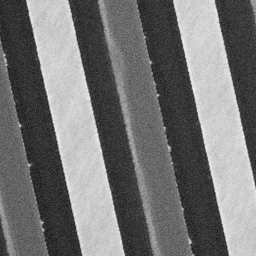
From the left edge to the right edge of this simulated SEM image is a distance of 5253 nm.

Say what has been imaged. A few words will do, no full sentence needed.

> lines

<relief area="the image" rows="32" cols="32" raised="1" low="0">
00011111100001111000001111100000
00001111100001111000001111100000
00001111100001111100001111100000
00001111100001111100001111110000
00001111100000111100000111110000
00000111110000111100000111110000
00000111110000111100000111110000
10000111110000011110000111110000
10000111110000011110000111111000
10000111111000011110000011111000
10000011111000011110000011111000
10000011111000011111000011111000
11000011111000001111000011111100
11000011111000001111000001111100
11000001111100001111000001111100
11000001111100001111000001111100
11100001111100001111100001111100
11100001111100001111100001111110
11100001111110000111100000111110
11100000111110000111100000111110
11100000111110000111100000111110
11110000111110000111110000111110
11110000111110000011110000011111
11110000011111000011110000011111
11110000011111000011110000011111
11111000011111000011111000011111
11111000011111000001111000001111
01111000011111100001111000001111
01111000001111100001111000001111
01111000001111100001111000001111
01111100001111100001111100001111
00111100001111100000111100000111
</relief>